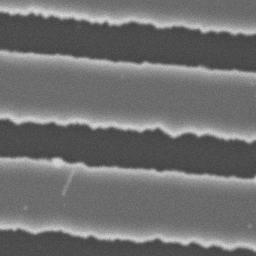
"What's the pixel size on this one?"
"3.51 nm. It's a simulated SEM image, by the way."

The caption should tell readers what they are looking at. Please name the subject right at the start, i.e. lines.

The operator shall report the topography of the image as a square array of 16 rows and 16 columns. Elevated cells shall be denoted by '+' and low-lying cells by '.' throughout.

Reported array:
++++++++++++++++
.........+++++++
................
++++............
+++++++++++++++.
++++++++++++++++
++++++++++++++++
.+++++++++++++++
..............++
................
+++++++.........
++++++++++++++++
++++++++++++++++
++++++++++++++++
..+.++++++++++++
..............++